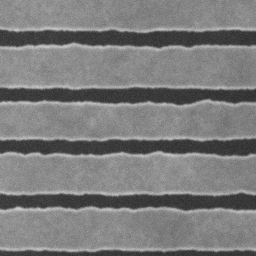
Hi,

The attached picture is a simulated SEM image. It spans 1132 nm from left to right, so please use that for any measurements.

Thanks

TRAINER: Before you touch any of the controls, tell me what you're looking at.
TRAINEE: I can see lines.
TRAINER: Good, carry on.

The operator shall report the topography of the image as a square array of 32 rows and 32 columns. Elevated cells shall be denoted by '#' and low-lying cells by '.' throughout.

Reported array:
################################
################################
################################
################################
................................
.........#......................
################################
################################
################################
################################
################################
................................
.........................#......
################################
################################
################################
################################
.........#.##...........##......
................................
##############################.#
################################
################################
################################
################################
................................
................................
################################
################################
################################
################################
################################
................................